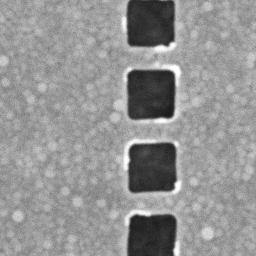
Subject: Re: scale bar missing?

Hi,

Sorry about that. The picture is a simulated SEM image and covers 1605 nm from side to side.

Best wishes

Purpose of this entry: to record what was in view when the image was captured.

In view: holes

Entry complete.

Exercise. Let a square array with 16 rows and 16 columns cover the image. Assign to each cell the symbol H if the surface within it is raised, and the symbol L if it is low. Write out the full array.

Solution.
HHHHHHHHLLLHHHHH
HHHHHHHHLLLHHHHH
HHHHHHHHLLLHHHHH
HHHHHHHHHHHHHHHH
HHHHHHHHLLLHHHHH
HHHHHHHHLLLHHHHH
HHHHHHHHLLLHHHHH
HHHHHHHHHHHHHHHH
HHHHHHHHHHHHHHHH
HHHHHHHHLLLHHHHH
HHHHHHHHLLLHHHHH
HHHHHHHHLLLHHHHH
HHHHHHHHHHHHHHHH
HHHHHHHHLLLHHHHH
HHHHHHHHLLLHHHHH
HHHHHHHHLLLHHHHH